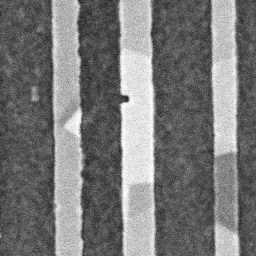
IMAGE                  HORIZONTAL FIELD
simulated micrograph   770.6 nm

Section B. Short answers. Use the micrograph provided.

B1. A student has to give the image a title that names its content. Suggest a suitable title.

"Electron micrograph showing one or a few lines or trenches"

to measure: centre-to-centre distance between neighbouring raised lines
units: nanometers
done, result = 238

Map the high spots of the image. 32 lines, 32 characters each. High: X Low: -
-------XXX-----XXXX--------XX---
-------XXX-----XXXX--------XX---
-------XXX-----XXXX-------XXX---
-------XXX-----XXXX-------XXX---
-------XXX-----XXXX--------XX---
-------XXX-----XXXX--------XX---
-------XXX-----XXXX--------XX---
-------XXX-----XXXX--------XX---
-------XXX-----XXXX--------XX---
-------XXX-----XXXX--------XX---
-------XXX-----XXXX--------XX---
-------XXX-----XXXX--------XX---
-------XXX------XXX--------XX---
-------XXX-----XXXX--------XX---
-------XXX-----XXXX--------XX---
-------XXX-----XXXX--------XX---
-------XXX-----XXXX--------XX---
-------XXX-----XXXX--------XX---
-------XXX-----XXXX--------XX---
-------XXX-----XXXX--------XX---
-------XXX-----XXXX--------XXX--
-------XXX-----XXXX--------XXX--
-------XXX-----XXXX--------XXX--
-------XXX-----XXXX--------XXX--
-------XXX-----XXXX--------XXX--
-------XXX-----XXXX--------XXX--
-------XXX-----XXXX--------XXX--
-------XXX------XXX--------XXX--
-------XXX------XXX--------XXX--
-------XXX------XXX--------XXX--
-------XXX------XXX--------XXX--
-------XXX------XXX--------XXX--